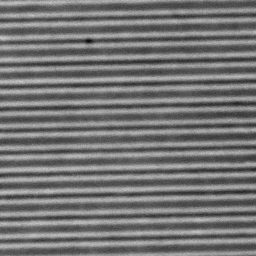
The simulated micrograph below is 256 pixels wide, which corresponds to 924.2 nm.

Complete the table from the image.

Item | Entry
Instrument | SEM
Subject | parallel lines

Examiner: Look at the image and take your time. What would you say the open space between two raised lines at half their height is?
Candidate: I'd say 32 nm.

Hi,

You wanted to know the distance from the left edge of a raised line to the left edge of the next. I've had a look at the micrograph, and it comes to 39.5 nanometers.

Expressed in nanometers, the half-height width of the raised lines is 12.6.